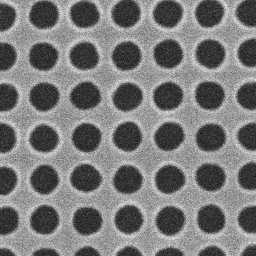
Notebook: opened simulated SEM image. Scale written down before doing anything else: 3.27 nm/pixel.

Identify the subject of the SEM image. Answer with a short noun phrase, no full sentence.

a regular array of holes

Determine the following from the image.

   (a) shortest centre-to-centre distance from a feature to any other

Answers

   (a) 132 nanometers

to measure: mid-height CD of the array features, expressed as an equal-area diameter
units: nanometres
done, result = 101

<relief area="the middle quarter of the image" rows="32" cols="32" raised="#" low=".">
##......#####.....######....####
###....######...################
################################
################################
####...########..########..#####
###.....#####......####......###
##.......###........##........##
#........###........##........##
#........###........##........##
##.......###........##........##
##......####.......####......###
####.########....#######....####
################################
################################
#####.########....#######...####
###.....#####......#####.....###
##.......####......####.......##
##........##........##........##
##.......###........##........##
##.......###.......###........##
##.......####......####......###
####....######....######....####
################################
################################
################################
###....#######....######....####
##.......####......####......###
#........####.......###.......##
#.........##........###........#
#.........##........###........#
##.......###.......####.......##
###.....#####......####......###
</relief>